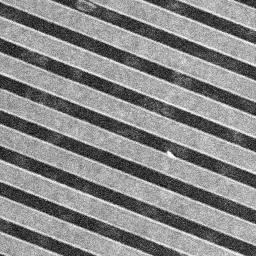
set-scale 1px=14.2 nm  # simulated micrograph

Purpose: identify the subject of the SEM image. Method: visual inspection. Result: parallel lines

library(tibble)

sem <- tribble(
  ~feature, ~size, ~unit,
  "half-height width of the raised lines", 268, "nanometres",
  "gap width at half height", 0.214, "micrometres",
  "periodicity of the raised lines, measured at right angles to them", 476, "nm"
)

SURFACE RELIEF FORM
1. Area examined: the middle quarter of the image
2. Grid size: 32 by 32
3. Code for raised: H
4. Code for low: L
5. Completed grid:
LLLHHHHHHHHHHHHLLLLLLLLLLHHHHHHH
LLLLLHHHHHHHHHHHHHLLLLLLLLLLHHHH
LLLLLLLLHHHHHHHHHHHHLLLLLLLLLLLH
LLLLLLLLLLHHHHHHHHHHHHHLLLLLLLLL
HHLLLLLLLLLLLHHHHHHHHHHHHLLLLLLL
HHHHHLLLLLLLLLLHHHHHHHHHHHHHLLLL
HHHHHHHLLLLLLLLLLLHHHHHHHHHHHHHL
HHHHHHHHHHLLLLLLLLLLHHHHHHHHHHHH
HHHHHHHHHHHHLLLLLLLLLLLHHHHHHHHH
LLHHHHHHHHHHHHHLLLLLLLLLLHHHHHHH
LLLLLHHHHHHHHHHHHHLLLLLLLLLLHHHH
LLLLLLLHHHHHHHHHHHHHLLLLLLLLLLLH
LLLLLLLLLLHHHHHHHHHHHHHLLLLLLLLL
HHHLLLLLLLLLHHHHHHHHHHHHHLLLLLLL
HHHHHLLLLLLLLLLHHHHHHHHHHHHHLLLL
HHHHHHHHLLLLLLLLLLHHHHHHHHHHHHLL
HHHHHHHHHHLLLLLLLLLLHHHHHHHHHHHH
HHHHHHHHHHHHLLLLLLLLLLLHHHHHHHHH
LLLHHHHHHHHHHHHLLLLLLLLLLHHHHHHH
LLLLLHHHHHHHHHHHHHLLLLLLLLLLHHHH
LLLLLLLLHHHHHHHHHHHHHLLLLLLLLLHH
LLLLLLLLLLHHHHHHHHHHHHHLLLLLLLLL
HHLLLLLLLLLLLHHHHHHHHHHHHHLLLLLL
HHHHHLLLLLLLLLLHHHHHHHHHHHHHLLLL
HHHHHHHHLLLLLLLLLLHHHHHHHHHHHHHL
HHHHHHHHHHLLLLLLLLLLHHHHHHHHHHHH
HHHHHHHHHHHHHLLLLLLLLLLHHHHHHHHH
LLHHHHHHHHHHHHHLLLLLLLLLLLHHHHHH
LLLLLHHHHHHHHHHHHHLLLLLLLLLLHHHH
LLLLLLLLHHHHHHHHHHHHLLLLLLLLLLLH
LLLLLLLLLLHHHHHHHHHHHHHLLLLLLLLL
HHHLLLLLLLLLLHHHHHHHHHHHHLLLLLLL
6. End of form